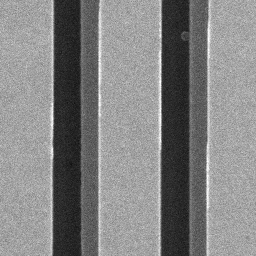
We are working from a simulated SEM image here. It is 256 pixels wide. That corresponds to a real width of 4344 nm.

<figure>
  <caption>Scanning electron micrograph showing lines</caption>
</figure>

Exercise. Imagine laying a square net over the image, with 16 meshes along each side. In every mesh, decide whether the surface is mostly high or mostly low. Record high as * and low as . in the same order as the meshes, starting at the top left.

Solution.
***...****...***
***...****...***
***...****...***
***...****...***
***...****...***
***...****...***
***...****...***
***...****...***
***...****...***
***...****...***
***...****...***
***...****...***
***...****...***
***...****...***
***...****...***
***...****...***